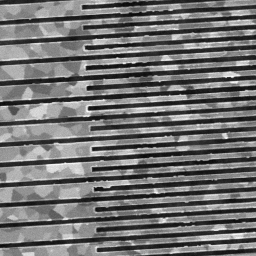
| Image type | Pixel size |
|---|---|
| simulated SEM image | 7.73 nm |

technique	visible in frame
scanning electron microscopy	parallel lines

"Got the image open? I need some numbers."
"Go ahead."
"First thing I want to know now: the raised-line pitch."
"10.1 pixels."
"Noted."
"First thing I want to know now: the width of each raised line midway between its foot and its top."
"40.5 nm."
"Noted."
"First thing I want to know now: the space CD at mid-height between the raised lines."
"40.5 nanometers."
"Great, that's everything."